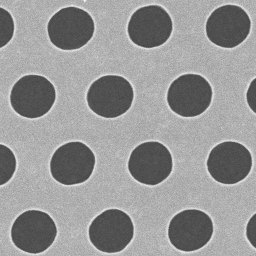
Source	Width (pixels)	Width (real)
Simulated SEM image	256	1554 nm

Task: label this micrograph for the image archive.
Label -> a regular array of holes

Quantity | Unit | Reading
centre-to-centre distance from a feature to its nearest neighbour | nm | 473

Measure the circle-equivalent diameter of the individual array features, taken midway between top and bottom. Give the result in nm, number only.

268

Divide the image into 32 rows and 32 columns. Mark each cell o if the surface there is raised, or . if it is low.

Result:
oooooooooooooooooooooooooooooooo
.oooooo....oooooo....oooooo....o
..oooo......oooo.....ooooo.....o
..oooo......oooo......oooo.....o
..oooo......oooo.....ooooo.....o
.oooooo....oooooo...ooooooo...oo
oooooooooooooooooooooooooooooooo
oooooooooooooooooooooooooooooooo
oooooooooooooooooooooooooooooooo
ooo..oooooooo..oooooooo..ooooooo
oo....oooooo....ooooo.....ooooo.
o......oooo......oooo......oooo.
o......oooo......oooo.....ooooo.
oo....ooooo.....ooooo.....ooooo.
ooo..oooooooo..oooooooo.oooooooo
oooooooooooooooooooooooooooooooo
oooooooooooooooooooooooooooooooo
oooooooooooooooooooooooooooooooo
.oooooo....oooooo....oooooo....o
..ooooo.....oooo.....ooooo.....o
..oooo......oooo......oooo.....o
..oooo......oooo.....ooooo.....o
.oooooo....oooooo....oooooo...oo
oooooooooooooooooooooooooooooooo
oooooooooooooooooooooooooooooooo
oooooooooooooooooooooooooooooooo
ooo..oooooooo..oooooooo..ooooooo
oo.....ooooo....ooooo.....ooooo.
o......oooo......oooo......oooo.
o......oooo......oooo.....ooooo.
oo....oooooo....oooooo....ooooo.
ooo..oooooooo.oooooooooooooooooo